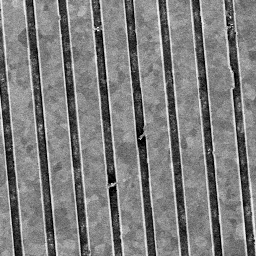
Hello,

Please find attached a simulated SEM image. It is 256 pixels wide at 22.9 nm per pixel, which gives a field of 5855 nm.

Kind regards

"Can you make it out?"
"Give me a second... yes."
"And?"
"parallel lines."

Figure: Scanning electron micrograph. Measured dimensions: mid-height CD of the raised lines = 532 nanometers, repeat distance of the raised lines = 758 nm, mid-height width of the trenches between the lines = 9.77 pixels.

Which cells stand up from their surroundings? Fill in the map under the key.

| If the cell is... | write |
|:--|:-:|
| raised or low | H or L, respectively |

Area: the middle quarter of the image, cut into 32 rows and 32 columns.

LLHHHHHHLLLHHHHHLLLHHHHHHLLHHHHH
LLLHHHHHLLLHHHHHLLLHHHHHHLLHHHHH
LLLHHHHHLLLHHHHHLLLHHHHHHLLHHHHH
LLLHHHHHLLLHHHHHHLLHHHHHHLLHHHHH
LLLHHHHHLLLHHHHHHLLHHHHHHLLLHHHH
LLLHHHHHHLLHHHHHHLLHHHHHHLLLHHHH
LLLHHHHHHLLHHHHHHLLLHHHHHLLLHHHH
LLLHHHHHHLLHHHHHHLLLHHHHHLLLHHHH
LLLHHHHHHLLHHHHHHLLLHHHHHLLLHHHH
HLLHHHHHHLLHHHHHHLLLHHHHHHLLHHHH
HLLHHHHHHLLLHHHHHLLLHHHHHHLLHHHH
HLLHHHHHHLLLHHHHHLLLHHHHHHLLHHHH
HLLLHHHHHLLLHHHHHLLLHHHHHHLLHHHH
HLLLHHHHHLLLHHHHHLLLHHHHHHLLHHHH
HLLLHHHHHLLLHHHHHHLLHHHHHHLLHHHH
HLLLHHHHHLLLHHHHHHLLHHHHHHLLLHHH
HLLLHHHHHLLLHHHHHHLLHHHHHHLLLHHH
HLLLHHHHHLLLHHHHHHLLHHHHHHLLLHHH
HLLLHHHHHHLLHHHHHHLLLHHHHHLLLHHH
HLLLHHHHHHLLHHHHHHLLLHHHHHLLLHHH
HHLLHHHHHHLLHHHHHHLLLHHHHHHLLHHH
HHLLHHHHHHLLLHHHHHLLLHHHHHHLLHHH
HHLLHHHHHHLLLHHHHHLLLHHHHHHLLHHH
HHLLLHHHHHLLLHHHHHLLLHHHHHHLLHHH
HHLLLHHHHHLLLHHHHHLLLHHHHHHLLHHH
HHLLLHHHHHLLLHHHHHHLLHHHHHHLLHHH
HHLLLHHHHHLLLHHHHHHLLHHHHHHLLLHH
HHLLLHHHHHHLLHHHHHHLLHHHHHHLLLHH
HHLLLHHHHHHLLHHHHHHLLLHHHHHLLLHH
HHLLLHHHHHHLLHHHHHHLLLHHHHHLLLHH
HHLLLHHHHHHLLHHHHHHLLLHHHHHLLLHH
HHLLLHHHHHHLLHHHHHHLLLHHHHHHLLHH